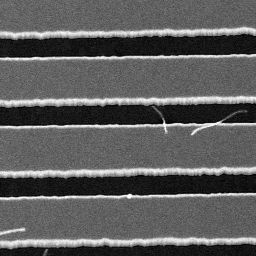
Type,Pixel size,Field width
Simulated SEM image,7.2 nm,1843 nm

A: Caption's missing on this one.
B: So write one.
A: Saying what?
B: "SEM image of lines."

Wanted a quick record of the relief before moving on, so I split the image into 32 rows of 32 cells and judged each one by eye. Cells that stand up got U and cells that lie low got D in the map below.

UUUUUUUUUUUUUUUUUUUUUUUUUUUUUUUU
UUUUUUUUUUUUUUUUUUUUUUUUUUUUUUUU
UUUUUUUUUUUUUUUUUUUUUUUUUUUUUUUU
UUUUUUUUUUUUUUUUUUUUUUUUUUUUUUUU
UUUUUUUUUUUDDDDDDDDDDDDDDDDDDDDD
DDDDDDDDDDDDDDDDDDDDDDDDDDDDDDDD
DDDDDDDDDDDDDDDDDDDDDDDDDDDDDDDD
UUUUUUUUUUUUUUUUUUUUUUUUUUUUUUUU
UUUUUUUUUUUUUUUUUUUUUUUUUUUUUUUU
UUUUUUUUUUUUUUUUUUUUUUUUUUUUUUUU
UUUUUUUUUUUUUUUUUUUUUUUUUUUUUUUU
UUUUUUUUUUUUUUUUUUUUUUUUUUUUUUUU
UUUUUUUUUUUUUUUUUUUUUUUUUUUUUUUU
DDDDDDDDDDDDDDDDDDDDDDDDDDDDDDDD
DDDDDDDDDDDDDDDDDDDDDDDDDDDDDDDD
DDDDDDDDDDDDDDDDDDDDUUUUUUUUUUUU
UUUUUUUUUUUUUUUUUUUUUUUUUUUUUUUU
UUUUUUUUUUUUUUUUUUUUUUUUUUUUUUUU
UUUUUUUUUUUUUUUUUUUUUUUUUUUUUUUU
UUUUUUUUUUUUUUUUUUUUUUUUUUUUUUUU
UUUUUUUUUUUUUUUUUUUUUUUUUUUUUUUU
UUUUUUUUUUUUUUUUUUUUUUUUUUUUUUUU
DDDDDDDDDDDDDDDDDDDDDDDDDDDDDDDD
DDDDDDDDDDDDDDDDDDDDDDDDDDDDDDDD
DDDDDDDDDDDDUDDUUUUUUUUUUUUUUUUU
UUUUUUUUUUUUUUUUUUUUUUUUUUUUUUUU
UUUUUUUUUUUUUUUUUUUUUUUUUUUUUUUU
UUUUUUUUUUUUUUUUUUUUUUUUUUUUUUUU
UUUUUUUUUUUUUUUUUUUUUUUUUUUUUUUU
UUUUUUUUUUUUUUUUUUUUUUUUUUUUUUUU
UUUUUUUUUUUUUUUUUUUDDDDDDDDDDDDD
DDDDDDDDDDDDDDDDDDDDDDDDDDDDDDDD